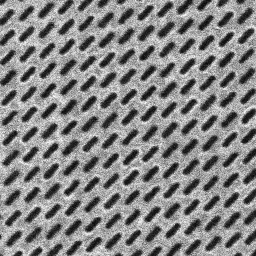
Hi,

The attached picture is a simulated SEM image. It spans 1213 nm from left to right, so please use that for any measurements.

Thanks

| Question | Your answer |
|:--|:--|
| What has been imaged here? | a regular array of holes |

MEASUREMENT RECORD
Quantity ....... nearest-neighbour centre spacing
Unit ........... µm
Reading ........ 0.0942